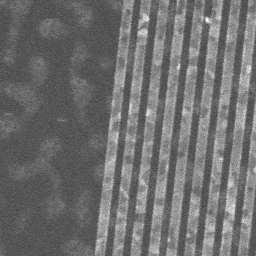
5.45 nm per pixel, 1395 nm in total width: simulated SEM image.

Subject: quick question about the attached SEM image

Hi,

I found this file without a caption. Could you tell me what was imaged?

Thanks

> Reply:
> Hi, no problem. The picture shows parallel lines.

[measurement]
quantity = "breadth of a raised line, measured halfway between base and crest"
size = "49.4 nm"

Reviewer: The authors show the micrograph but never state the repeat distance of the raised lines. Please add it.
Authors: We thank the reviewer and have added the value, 96.6 nm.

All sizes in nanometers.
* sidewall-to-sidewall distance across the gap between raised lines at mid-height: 46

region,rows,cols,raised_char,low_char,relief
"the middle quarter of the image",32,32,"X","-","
-------------XX---XX--XX---XX--X
-------------XX---XX--XX--XXX--X
-------------XX--XXX--XX--XX---X
-------------XX--XX---XX--XX---X
---X---------XX--XX---XX--XX---X
------X------XX--XX--XXX--XX---X
-------------XX--XX--XXX--XX--XX
------------XXX--XX--XX---XX--XX
------------XXX--XX--XX---XX--XX
------------XX---XX--XX---XX--XX
------------XX---XX--XX--XXX--XX
------------XX--XXX--XX--XX---XX
------------XX--XX---XX--XX---XX
------------XX--XX---XX--XX---XX
------------XX--XX---XX--XX---XX
------------XX--XX--XXX--XX--XXX
-----------XXX--XX--XX---XX--XX-
-----------XX---XX--XX---XX--XX-
-----------XX---XX--XX--XXX--XX-
-----------XX---XX--XX--XXX--XX-
-----------XX--XXX--XX--XX---XX-
-----------XX--XX---XX--XX---XX-
-----------XX--XX---XX--XX---XX-
-----------XX--XX---XX--XX---XX-
-----------XX--XX--XXX--XX--XXX-
----------XXX--XX--XX---XX--XX--
----------XX---XX--XX---XX--XX--
---------XXX---XXX-XX--XXX--XX--
----------XX---XX--XX--XX---XX--
----------XX--XXX--XX--XX---XX--
----------XX--XX---XX--XX---XX--
----------XX--XX---XX--XX---XX--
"